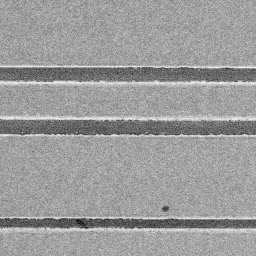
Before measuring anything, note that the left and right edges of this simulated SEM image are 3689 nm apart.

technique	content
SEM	lines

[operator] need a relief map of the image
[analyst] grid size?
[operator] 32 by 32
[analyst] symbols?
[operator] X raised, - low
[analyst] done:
XXXXXXXXXXXXXXXXXXXXXXXXXXXXXXXX
XXXXXXXXXXXXXXXXXXXXXXXXXXXXXXXX
XXXXXXXXXXXXXXXXXXXXXXXXXXXXXXXX
XXXXXXXXXXXXXXXXXXXXXXXXXXXXXXXX
XXXXXXXXXXXXXXXXXXXXXXXXXXXXXXXX
XXXXXXXXXXXXXXXXXXXXXXXXXXXXXXXX
XXXXXXXXXXXXXXXXXXXXXXXXXXXXXXXX
XXXXXXXXXXXXXXXXXXXXXXXXXXXXXXXX
--------------------------------
--------------------------------
XXXXXXXXXXXXXXXXXXXXXXXXXXXXXXXX
XXXXXXXXXXXXXXXXXXXXXXXXXXXXXXXX
XXXXXXXXXXXXXXXXXXXXXXXXXXXXXXXX
XXXXXXXXXXXXXXXXXXXXXXXXXXXXXXXX
XXXXXXXXXXXXXXXXXXXXXXXXXXXXXXXX
--------------------------------
--------------------------------
XXXXXXXXXXXXXXXXXXXXXXXXXXXXXXXX
XXXXXXXXXXXXXXXXXXXXXXXXXXXXXXXX
XXXXXXXXXXXXXXXXXXXXXXXXXXXXXXXX
XXXXXXXXXXXXXXXXXXXXXXXXXXXXXXXX
XXXXXXXXXXXXXXXXXXXXXXXXXXXXXXXX
XXXXXXXXXXXXXXXXXXXXXXXXXXXXXXXX
XXXXXXXXXXXXXXXXXXXXXXXXXXXXXXXX
XXXXXXXXXXXXXXXXXXXXXXXXXXXXXXXX
XXXXXXXXXXXXXXXXXXXXXXXXXXXXXXXX
XXXXXXXXXXXXXXXXXXXXXXXXXXXXXXXX
--------------------------------
--------------------------------
XXXXXXXXXXXXXXXXXXXXXXXXXXXXXXXX
XXXXXXXXXXXXXXXXXXXXXXXXXXXXXXXX
XXXXXXXXXXXXXXXXXXXXXXXXXXXXXXXX